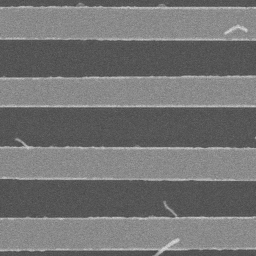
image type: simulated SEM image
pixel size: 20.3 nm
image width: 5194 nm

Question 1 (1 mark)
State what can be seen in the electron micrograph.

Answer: lines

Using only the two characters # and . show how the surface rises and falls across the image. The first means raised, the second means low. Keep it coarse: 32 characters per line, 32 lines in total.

................................
################################
################################
################################
################################
................................
................................
................................
................................
................................
################################
################################
################################
................................
................................
................................
................................
................................
#############################.#.
################################
################################
################################
..................##############
................................
................................
................................
................................
################################
################################
################################
################################
................................